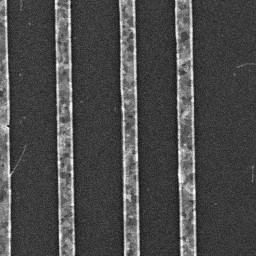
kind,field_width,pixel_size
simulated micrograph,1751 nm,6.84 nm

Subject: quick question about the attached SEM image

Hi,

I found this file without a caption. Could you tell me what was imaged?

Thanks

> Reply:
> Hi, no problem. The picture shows one or a few lines or trenches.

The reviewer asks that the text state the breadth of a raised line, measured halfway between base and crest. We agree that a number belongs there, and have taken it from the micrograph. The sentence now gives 13.4 pixels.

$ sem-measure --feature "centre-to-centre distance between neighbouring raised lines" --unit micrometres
0.414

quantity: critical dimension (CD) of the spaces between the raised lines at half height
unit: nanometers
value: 342